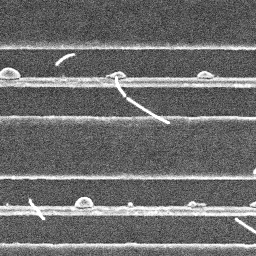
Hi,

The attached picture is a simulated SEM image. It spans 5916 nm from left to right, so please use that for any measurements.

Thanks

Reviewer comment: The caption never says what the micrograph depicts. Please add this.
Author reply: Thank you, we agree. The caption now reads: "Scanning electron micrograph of lines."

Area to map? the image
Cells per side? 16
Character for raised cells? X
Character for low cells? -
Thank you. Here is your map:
XXXXXXXXXXXXXXXX
XXXXXXXXXXXXXXXX
XXXXXXXXXXXXXXXX
----------------
X---------------
----------------
----------------
XXXXXXXXXXXXXXXX
XXXXXXXXXXXXXXXX
XXXXXXXXXXXXXXXX
XXXXXXXXXXXXXXXX
----------------
----------------
----------------
----------------
XXXXXXXXXXXXXXXX